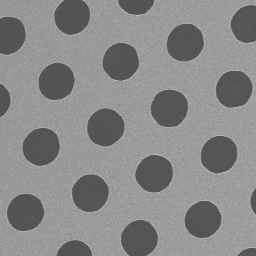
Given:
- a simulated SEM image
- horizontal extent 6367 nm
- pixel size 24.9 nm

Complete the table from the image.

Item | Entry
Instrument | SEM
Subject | a regular array of holes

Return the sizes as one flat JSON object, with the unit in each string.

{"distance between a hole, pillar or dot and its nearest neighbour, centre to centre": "66.9 px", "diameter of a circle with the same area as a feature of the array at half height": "931 nanometres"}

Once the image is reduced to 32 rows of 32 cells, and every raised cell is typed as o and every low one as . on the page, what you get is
ooooooo....oooo....ooooooooooooo
ooooooo....ooooo..oooooooooooo..
..ooooo....oooooooooooooooooo...
...oooo....ooooooooooo...oooo...
...oooooooooooooooooo....oooo...
...ooooooooooo..ooooo....ooooooo
..ooooooooooo....oooo....ooooooo
ooooooooooooo....ooooo..oooooooo
oooooo...oooo....ooooooooooooooo
ooooo....ooooo..oooooooooooo...o
ooooo....oooooooooooooooooo....o
.oooo....ooooooooooo..ooooo.....
.oooooooooooooooooo....oooo....o
.oooooooooooooooooo.....oooooooo
ooooooooooo....oooo....ooooooooo
ooooooooooo.....oooo..oooooooooo
oooo...oooo....ooooooooooooooooo
ooo....oooo....ooooooooooo...ooo
ooo....oooooooooooooooooo.....oo
ooo....oooooooooooo.ooooo.....oo
oooo..ooooooooooo....oooo....ooo
ooooooooooooooooo.....oooo..oooo
oooooooooo...oooo....ooooooooooo
ooooooooo.....oooo...ooooooooooo
oo..ooooo.....ooooooooooooooooo.
o....oooo....ooooooooooo...oooo.
o.....ooooooooooooooooo....ooooo
o....oooooooooooo.ooooo.....oooo
oo..oooooooooooo...oooo....ooooo
ooooooooooooooo.....oooo..oooooo
oooooooo...oooo.....oooooooooooo
ooooooo....ooooo...ooooooooooo..